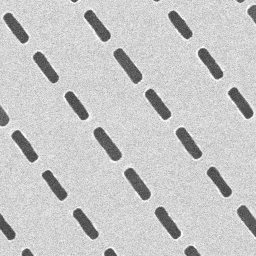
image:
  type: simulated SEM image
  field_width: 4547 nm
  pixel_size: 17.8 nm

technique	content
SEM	a regular array of holes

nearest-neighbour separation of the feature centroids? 873 nanometers